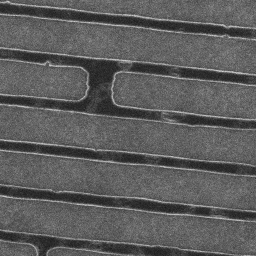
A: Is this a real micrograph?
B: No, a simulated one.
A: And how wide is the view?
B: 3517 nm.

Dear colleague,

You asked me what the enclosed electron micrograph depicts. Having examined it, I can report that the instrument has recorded parallel lines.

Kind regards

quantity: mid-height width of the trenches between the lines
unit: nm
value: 461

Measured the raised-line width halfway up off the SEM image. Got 161 nm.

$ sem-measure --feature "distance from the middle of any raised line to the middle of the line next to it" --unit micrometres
0.624